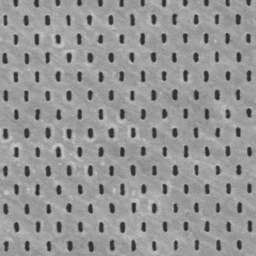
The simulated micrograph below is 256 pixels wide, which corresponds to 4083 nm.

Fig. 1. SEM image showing a regular array of holes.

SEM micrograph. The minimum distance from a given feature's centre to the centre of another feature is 333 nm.